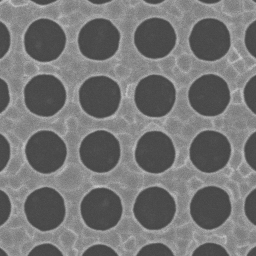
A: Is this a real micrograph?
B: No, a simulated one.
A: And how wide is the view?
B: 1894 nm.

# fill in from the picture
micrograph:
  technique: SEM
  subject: a regular array of holes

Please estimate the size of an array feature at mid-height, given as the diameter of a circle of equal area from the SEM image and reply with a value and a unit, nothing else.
310 nm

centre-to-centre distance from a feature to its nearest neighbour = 404 nanometers